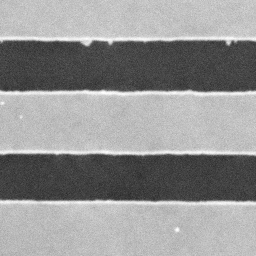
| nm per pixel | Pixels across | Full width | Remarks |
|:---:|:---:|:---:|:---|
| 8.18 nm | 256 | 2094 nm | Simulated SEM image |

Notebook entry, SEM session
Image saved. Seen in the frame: lines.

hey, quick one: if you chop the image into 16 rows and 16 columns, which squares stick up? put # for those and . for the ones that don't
################
################
....#######.....
................
................
................
################
################
################
################
................
................
................
################
################
################